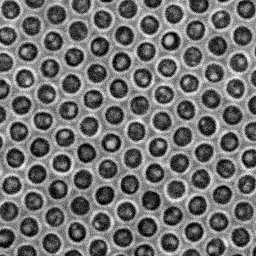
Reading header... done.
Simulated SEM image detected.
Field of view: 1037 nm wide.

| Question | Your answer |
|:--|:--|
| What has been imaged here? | a regular array of holes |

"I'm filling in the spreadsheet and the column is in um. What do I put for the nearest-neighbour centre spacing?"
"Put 0.107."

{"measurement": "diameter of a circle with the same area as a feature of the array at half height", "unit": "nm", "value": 81.6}